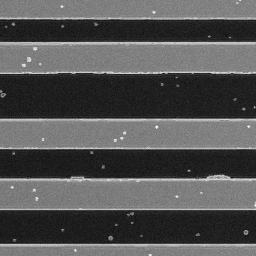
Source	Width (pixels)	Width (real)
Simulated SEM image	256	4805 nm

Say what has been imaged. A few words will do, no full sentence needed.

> lines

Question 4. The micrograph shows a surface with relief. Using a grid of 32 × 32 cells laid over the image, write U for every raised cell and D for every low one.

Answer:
UUUUUUUUUUUUUUUUUUUUUUUUUUUUUUUU
UUUUUUUUUUUUUUUUUUUUUUUUUUUUUUUU
DDDDDDDDDDDDDDDDDDDDDDDDDDDDDDDD
DDDDDDDDDDDDDDDDDDDDDDDDDDDDDDDD
DDDDDDDDDDDDDDDDDDDDDDDDDDDDDDDD
UUUUUUUUUUUUUUUUUUUUUUUUUUUUUUUU
UUUUUUUUUUUUUUUUUUUUUUUUUUUUUUUU
UUUUUUUUUUUUUUUUUUUUUUUUUUUUUUUU
UUUUUUUUUUUUUUUUUUUUUUUUUUUUUUUU
DDDDDDDDDDDDDDDDDDDDDDDDDDDDDDDD
DDDDDDDDDDDDDDDDDDDDDDDDDDDDDDDD
DDDDDDDDDDDDDDDDDDDDDDDDDDDDDDDD
DDDDDDDDDDDDDDDDDDDDDDDDDDDDDDDD
DDDDDDDDDDDDDDDDDDDDDDDDDDDDDDDD
DDDDDDDDDDDDDDDDDDDDDDDDDDDDDDDD
UUUUUUUUUUUUUUUUUUUUUUUUUUUUUUUU
UUUUUUUUUUUUUUUUUUUUUUUUUUUUUUUU
UUUUUUUUUUUUUUUUUUUUUUUUUUUUUUUU
UUUUUUUUUUUUUUUUUUUUUUUUUUUUUUUU
DDDDDDDDDDDDDDDDDDDDDDDDDDDDDDDD
DDDDDDDDDDDDDDDDDDDDDDDDDDDDDDDD
DDDDDDDDDDDDDDDDDDDDDDDDDDDDDDDD
UUUUUUUUUUUUUUUUUUUUUUUUUUUUUUUU
UUUUUUUUUUUUUUUUUUUUUUUUUUUUUUUU
UUUUUUUUUUUUUUUUUUUUUUUUUUUUUUUU
UUUUUUUUUUUUUUUUUUUUUUUUUUUUUUUU
DDDDDDDDDDDDDDDDDDDDDDDDDDDDDDDD
DDDDDDDDDDDDDDDDDDDDDDDDDDDDDDDD
DDDDDDDDDDDDDDDDDDDDDDDDDDDDDDDD
DDDDDDDDDDDDDDDDDDDDDDDDDDDDDDDD
DDDDDDDDDDDDDDDDDDDDDDDDDDDDDDDD
UUUUUUUUUUUUUUUUUUUUUUUUUUUUUUUU